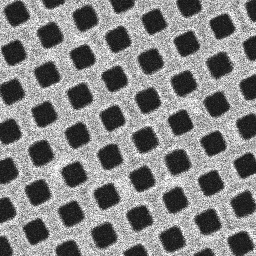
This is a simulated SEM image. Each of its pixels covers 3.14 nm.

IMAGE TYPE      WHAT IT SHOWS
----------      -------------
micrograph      a regular array of holes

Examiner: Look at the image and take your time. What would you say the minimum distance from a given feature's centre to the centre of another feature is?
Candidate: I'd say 122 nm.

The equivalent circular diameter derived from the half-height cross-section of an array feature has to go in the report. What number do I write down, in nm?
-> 74.3